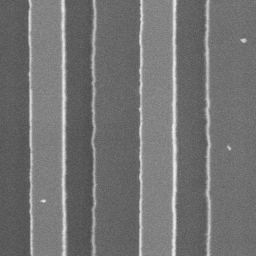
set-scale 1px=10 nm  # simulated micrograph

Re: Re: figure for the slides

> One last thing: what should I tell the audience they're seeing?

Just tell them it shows lines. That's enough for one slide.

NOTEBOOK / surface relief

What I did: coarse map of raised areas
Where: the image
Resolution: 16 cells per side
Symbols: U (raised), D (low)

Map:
DDUUDDDDDUUDDDDD
DDUUDDDDDUUDDDDD
DDUUDDDDDUUDDDDD
DDUUDDDDDUUDDDDD
DDUUDDDDDUUDDDDD
DDUUDDDDDUUDDDDD
DDUUDDDDDUUDDDDD
DDUUDDDDDUUDDDDD
DDUUDDDDDUUDDDDD
DDUUDDDDDUUDDDDD
DDUUDDDDDUUDDDDD
DDUUDDDDDUUDDDDD
DDUUDDDDDUUDDDDD
DDUUDDDDDUUDDDDD
DDUUDDDDDUUDDDDD
DDUUDDDDDUUDDDDD